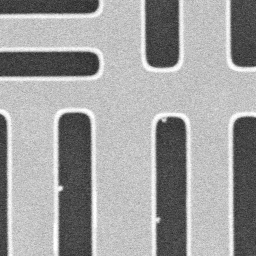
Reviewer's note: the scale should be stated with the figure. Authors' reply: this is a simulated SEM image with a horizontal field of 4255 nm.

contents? groups of lines, slits or small figures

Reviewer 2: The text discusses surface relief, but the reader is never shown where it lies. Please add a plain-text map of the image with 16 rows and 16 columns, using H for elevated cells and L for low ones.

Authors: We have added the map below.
LLLLLLHHHLLHHHLL
HHHHHHHHHLLHHHLL
HHHHHHHHHLLHHHLL
LLLLLLHHHLLHHHLL
LLLLLLHHHHHHHHHH
HHHHHHHHHHHHHHHH
HHHHHHHHHHHHHHHH
HHHHLLHHHHLHHHHL
LHHLLLHHHHLLHHLL
LHHLLLHHHHLLHHLL
LHHLLLHHHHLLHHLL
LHHHLLHHHHLLHHLL
LHHHLLHHHHLLHHLL
LHHHLLHHHHLLHHLL
LHHHLLHHHHLLHHLL
LHHHLLHHHHLLHHLL